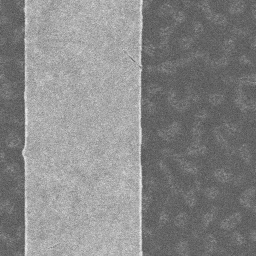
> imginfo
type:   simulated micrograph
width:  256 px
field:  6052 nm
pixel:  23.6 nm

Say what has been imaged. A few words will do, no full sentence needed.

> one or a few lines or trenches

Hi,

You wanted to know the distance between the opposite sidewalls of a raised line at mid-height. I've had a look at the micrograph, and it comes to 2.72 micrometres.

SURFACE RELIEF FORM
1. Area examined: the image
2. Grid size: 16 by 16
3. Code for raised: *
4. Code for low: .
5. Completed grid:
..*******.......
..*******.......
..*******.......
..*******.......
..*******.......
..*******.......
..*******.......
..*******.......
..*******.......
..*******.......
..*******.......
..*******.......
..*******.......
..*******.......
..*******.......
..*******.......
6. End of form